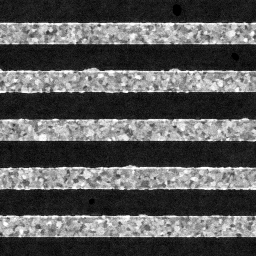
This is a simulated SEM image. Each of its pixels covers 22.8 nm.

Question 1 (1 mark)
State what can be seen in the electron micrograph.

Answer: lines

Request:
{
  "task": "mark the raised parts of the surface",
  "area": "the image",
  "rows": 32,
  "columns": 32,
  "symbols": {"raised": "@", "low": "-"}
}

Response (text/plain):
--------------------------------
--------------------------------
--------------------------------
@@@@@@@@@@@@@@@@@@@@@@@@@@@@@@@@
@@@@@@@@@@@@@@@@@@@@@@@@@@@@@@@@
--------------------------------
--------------------------------
--------------------------------
--------------------------------
@@@@@@@@@@@@@@@@@@@@@@@@@@@@@@@@
@@@@@@@@@@@@@@@@@@@@@@@@@@@@@@@@
@@@@@@@-@-@--@@@@------@--------
--------------------------------
--------------------------------
--------------------------------
@@@@@@@@@@@@@@@@@@@@@@@@@@@@@@@@
@@@@@@@@@@@@@@@@@@@@@@@@@@@@@@@@
-----------------@------@-@@--@@
--------------------------------
--------------------------------
--------------------------------
@@@@@@@@@@@@@@@@@@@@@@@@@@@@@@@@
@@@@@@@@@@@@@@@@@@@@@@@@@@@@@@@@
@@@@@@@@@@@@@@@@@@@@@@@@@@@@@@@@
--------------------------------
--------------------------------
--------------------------------
@@@@@@@@@@@@@@@@@@@@@@@@@@@@@@@@
@@@@@@@@@@@@@@@@@@@@@@@@@@@@@@@@
@@@@@@@@@@@@@@@@@@@@@@@@@@@@@@@@
--------------------------------
--------------------------------